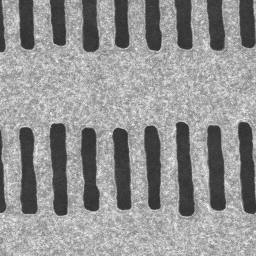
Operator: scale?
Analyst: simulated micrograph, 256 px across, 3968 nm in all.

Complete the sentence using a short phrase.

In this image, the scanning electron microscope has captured holes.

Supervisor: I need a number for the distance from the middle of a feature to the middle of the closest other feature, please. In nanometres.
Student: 483